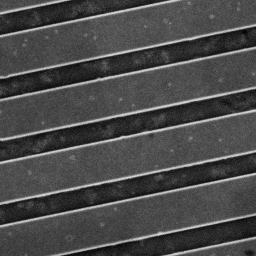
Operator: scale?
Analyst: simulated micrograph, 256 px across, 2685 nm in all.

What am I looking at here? one or a few lines or trenches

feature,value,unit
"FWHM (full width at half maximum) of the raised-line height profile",0.425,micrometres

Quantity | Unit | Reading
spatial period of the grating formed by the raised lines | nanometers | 650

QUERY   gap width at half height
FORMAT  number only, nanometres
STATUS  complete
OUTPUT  229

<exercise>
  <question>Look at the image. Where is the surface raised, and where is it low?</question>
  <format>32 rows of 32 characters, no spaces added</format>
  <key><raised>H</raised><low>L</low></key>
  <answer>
HHHHHHLLLLLLLLLLLLLLHHHHHHHHHHHH
HLLLLLLLLLLLLLLHHHHHHHHHHHHHHHHH
LLLLLLLLLLHHHHHHHHHHHHHHHHHHHHHH
LLLLLHHHHHHHHHHHHHHHHHHHHHHHHHLL
HHHHHHHHHHHHHHHHHHHHHHHHHLLLLLLL
HHHHHHHHHHHHHHHHHHHHLLLLLLLLLLLL
HHHHHHHHHHHHHHHHLLLLLLLLLLLLLHHH
HHHHHHHHHHHLLLLLLLLLLLLLHHHHHHHH
HHHHHHLLLLLLLLLLLLLHHHHHHHHHHHHH
HLLLLLLLLLLLLLHHHHHHHHHHHHHHHHHH
LLLLLLLLLLHHHHHHHHHHHHHHHHHHHHHH
LLLLLHHHHHHHHHHHHHHHHHHHHHHHHLLL
HHHHHHHHHHHHHHHHHHHHHHHHLLLLLLLL
HHHHHHHHHHHHHHHHHHHHLLLLLLLLLLLL
HHHHHHHHHHHHHHHLLLLLLLLLLLLLHHHH
HHHHHHHHHHLLLLLLLLLLLLLHHHHHHHHH
HHHHHLLLLLLLLLLLLLHHHHHHHHHHHHHH
LLLLLLLLLLLLLLHHHHHHHHHHHHHHHHHH
LLLLLLLLLHHHHHHHHHHHHHHHHHHHHHHH
LLLLHHHHHHHHHHHHHHHHHHHHHHHHHLLL
HHHHHHHHHHHHHHHHHHHHHHHHLLLLLLLL
HHHHHHHHHHHHHHHHHHHLLLLLLLLLLLLL
HHHHHHHHHHHHHHLLLLLLLLLLLLLLHHHH
HHHHHHHHHHLLLLLLLLLLLLLHHHHHHHHH
HHHHHLLLLLLLLLLLLLHHHHHHHHHHHHHH
LLLLLLLLLLLLLHHHHHHHHHHHHHHHHHHH
LLLLLLLLLHHHHHHHHHHHHHHHHHHHHHHH
LLLLHHHHHHHHHHHHHHHHHHHHHHHHHLLL
HHHHHHHHHHHHHHHHHHHHHHHHLLLLLLLL
HHHHHHHHHHHHHHHHHHHLLLLLLLLLLLLL
HHHHHHHHHHHHHHLLLLLLLLLLLLLLHHHH
HHHHHHHHHLLLLLLLLLLLLLLHHHHHHHHH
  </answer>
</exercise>